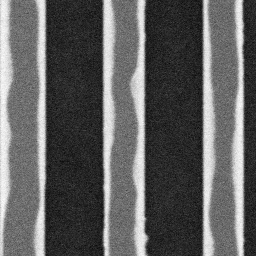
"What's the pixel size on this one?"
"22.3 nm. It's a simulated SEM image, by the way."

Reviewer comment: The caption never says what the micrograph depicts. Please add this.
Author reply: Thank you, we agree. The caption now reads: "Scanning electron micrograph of lines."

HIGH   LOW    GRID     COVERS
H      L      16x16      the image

HHHLLLLHHLLLLHHL
HHHLLLLHHLLLLHHL
HHHLLLLHHLLLLHHL
HHHLLLLHHLLLLHHL
HHHLLLLHHLLLLHHL
HHHLLLLHHLLLLHHL
HHHLLLLHHLLLLHHL
HHHLLLLHHLLLLHHL
HHHLLLLHHLLLLHHL
HHHLLLLHHLLLLHHL
HHHLLLLHHLLLLHHL
HHHLLLLHHLLLLHHL
HHHLLLLHHLLLLHHL
HHHLLLLHHLLLLHHL
HHHLLLLHHLLLLHHL
HHHLLLLHHLLLLHHL